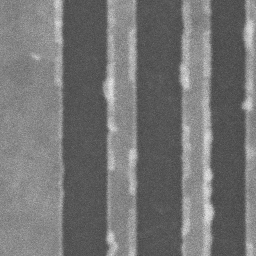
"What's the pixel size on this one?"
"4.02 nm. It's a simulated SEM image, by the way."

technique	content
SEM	one or a few lines or trenches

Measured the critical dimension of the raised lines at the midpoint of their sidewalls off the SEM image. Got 108 nanometers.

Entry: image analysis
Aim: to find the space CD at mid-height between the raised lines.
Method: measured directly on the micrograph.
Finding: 0.185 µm